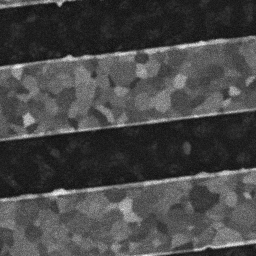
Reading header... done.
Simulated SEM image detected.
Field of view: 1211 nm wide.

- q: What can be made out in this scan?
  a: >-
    one or a few lines or trenches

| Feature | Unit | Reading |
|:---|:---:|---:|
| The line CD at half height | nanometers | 344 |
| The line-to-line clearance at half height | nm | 274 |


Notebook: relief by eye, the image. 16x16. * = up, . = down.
................
................
.............***
.....***********
****************
****************
****************
***********.....
**..............
................
................
.........*******
****************
****************
****************
*************...